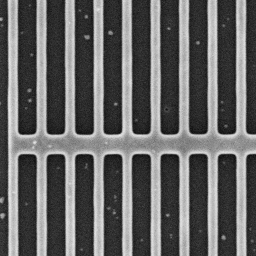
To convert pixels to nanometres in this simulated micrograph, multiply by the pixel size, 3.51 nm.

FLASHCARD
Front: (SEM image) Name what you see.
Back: groups of lines, slits or small figures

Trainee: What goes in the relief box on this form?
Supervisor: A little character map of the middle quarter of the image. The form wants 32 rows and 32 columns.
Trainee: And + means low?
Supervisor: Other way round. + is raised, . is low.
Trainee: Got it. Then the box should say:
+++.....++.....++.....++.....++.
.++.....++.....++.....++.....++.
.++.....++.....++.....++.....++.
.++.....++.....++.....++.....++.
.++.....++.....++.....++.....++.
.++.....++.....++.....++.....++.
.++.....++.....++.....++.....++.
.++.....++.....++.....++.....++.
.++.....++.....++.....++.....++.
.++.....++.....++.....++.....++.
.++.....++.....++.....++.....++.
.++.....++.....++.....++.....++.
.++.....++.....++.....++.....++.
.++.....++.....++.....++.....++.
.++.....++.....++.....++.....++.
.++.....++.....++.....++.....++.
+++.....++.....++.....++.....++.
+++....+++....++++...++++...++++
++++++++++++++++++++++++++++++++
++++++++++++++++++++++++++++++++
++++++++++++++++++++++++++++++++
++++++++++++++++++++++++++++++++
++++..+++++..+++++...++++...++++
+++....+++.....++.....++.....++.
.++.....++.....++.....++.....++.
.++.....++.....++.....++.....++.
.++.....++.....++.....++.....++.
.++.....++.....++.....++.....++.
.++.....++.....++.....++.....++.
.++.....++.....++.....++.....++.
.++.....++.....++.....++.....++.
.++.....++.....++.....++.....++.